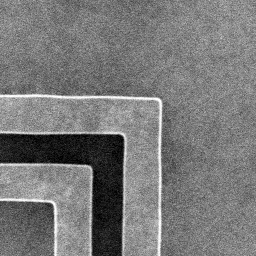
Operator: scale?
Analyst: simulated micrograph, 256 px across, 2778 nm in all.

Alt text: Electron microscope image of groups of lines, slits or small figures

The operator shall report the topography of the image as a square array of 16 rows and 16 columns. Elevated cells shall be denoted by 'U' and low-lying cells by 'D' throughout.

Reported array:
DDDDDDDDDDDDDDDD
DDDDDDDDDDDDDDDD
DDDDDDDDDDDDDDDD
DDDDDDDDDDDDDDDD
DDDDDDDDDDDDDDDD
DDDDDDDDDDDDDDDD
UUUUUUUUUUDDDDDD
UUUUUUUUUUDDDDDD
DDDDDDDUUUDDDDDD
DDDDDDDDUUDDDDDD
UUUUUDDDUUDDDDDD
UUUUUUDDUUDDDDDD
DUUUUUDDUUDDDDDD
DDDUUUDDUUDDDDDD
DDDUUUDDUUDDDDDD
DDDUUUDDUUDDDDDD